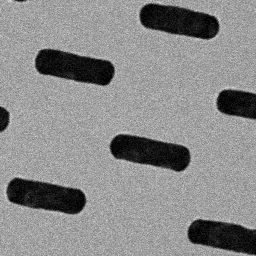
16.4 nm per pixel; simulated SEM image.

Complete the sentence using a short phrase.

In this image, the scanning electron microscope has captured holes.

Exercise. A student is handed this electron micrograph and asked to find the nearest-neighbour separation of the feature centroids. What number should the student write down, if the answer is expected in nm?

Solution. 1870